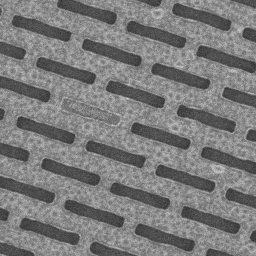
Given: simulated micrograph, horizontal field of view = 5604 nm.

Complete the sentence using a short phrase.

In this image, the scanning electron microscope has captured a regular array of holes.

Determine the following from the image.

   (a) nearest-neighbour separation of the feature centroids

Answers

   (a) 48 pixels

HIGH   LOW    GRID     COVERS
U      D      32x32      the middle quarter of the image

DDUUUUUUUUUUUUUUUDDUUUDDDDUUUUUU
DDDDDUUUUUUUUUUUUUUUUUDDDDDDDUUU
DDDDDDDDUUUUUUUUUUUUUUDDDDDDDDDD
UDDDDDDDUUUUUUUUUUUUUUUUUDDDDDDD
UUUUDDDDUUUDDUUUUUUUUUUUUUUUDDDD
UUUUUUUUUUDDDDDDDUUUUUUUUUUUUUUD
UUUUUUUUUUDDDDDDDDDDUUUUUUUUUUUU
UUUUUUUUUUUUDDDDDDDDDDUUUUUUUUUU
UUUUUUUUUUUUUUUDDDDDDDDDDUUUUUUU
UUDDUUUUUUUUUUUUUUUDDDDDDUUUUUUU
UUDDDDDUUUUUUUUUUUUUUUDDDUUUUDUU
UUDDDDDDDDUUUUUUUUUUUUUUUUUUDDDD
UUUDDDDDDDDDUUUUUUUUUUUUUUUUDDDD
UUUUUUDDDDDUUUUUUUUUUUUUUUUUUUDD
UUUUUUUUUUDUUUUUUUUUUUUUUUUUUUUU
UUUUUUUUUUUUUUUUUDDDDUUUUUUUUUUU
UUUUUUUUUUUUUUUUUDDDDDDDDUUUUUUU
DDDUUUUUUUUUUUUUUDDDDDDDDDDDUUUU
DDDUUUUUUUUUUUUUUUUUDDDDDDDDDDDU
DDDUUUDDUUUUUUUUUUUUUUUUDDDDDDDD
UUUUUDDDDDDDUUUUUUUUUUUUUUUDDDDU
UUUUUDDDDDDDDDDUUUUUUUUUUUUUUUDU
UUUUUUUUDDDDDDDDDDUUUUUUUUUUUUUU
UUUUUUUUUUUDDDDDDDDDUUUUUUUUUUUU
UUUUUUUUUUUUUUDDDDDDUUUUUUUUUUUU
DDUUUUUUUUUUUUUUUDDDUUUDDDUUUUUU
DDDDDUUUUUUUUUUUUUUUUUUDDDDDDUUU
DDDDDDDDUUUUUUUUUUUUUUUDDDDDDDDD
UDDDDDDDDUUUUUUUUUUUUUUUUDDDDDDD
UUUUDDDDDUUUUUUUUUUUUUUUUUUUDDDD
UUUUUUUDUUUUDDDDUUUUUUUUUUUUUUUD
UUUUUUUUUUUDDDDDDDDDUUUUUUUUUUUU